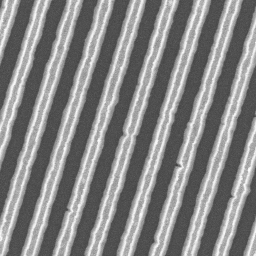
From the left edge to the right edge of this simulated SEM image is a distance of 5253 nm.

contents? parallel lines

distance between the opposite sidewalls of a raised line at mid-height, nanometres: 243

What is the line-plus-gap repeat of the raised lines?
625 nm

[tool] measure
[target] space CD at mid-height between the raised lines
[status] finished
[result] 395 nm